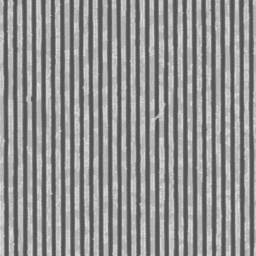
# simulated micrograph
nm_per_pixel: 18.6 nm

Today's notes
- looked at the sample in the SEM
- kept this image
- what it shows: parallel lines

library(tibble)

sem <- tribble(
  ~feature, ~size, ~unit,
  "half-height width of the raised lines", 102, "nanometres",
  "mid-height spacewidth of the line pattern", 83.5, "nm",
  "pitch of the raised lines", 175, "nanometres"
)